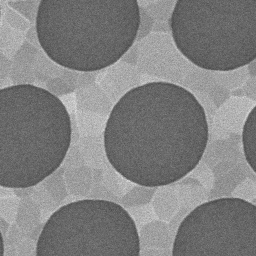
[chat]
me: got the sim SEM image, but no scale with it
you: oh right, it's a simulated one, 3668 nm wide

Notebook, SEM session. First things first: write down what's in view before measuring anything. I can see holes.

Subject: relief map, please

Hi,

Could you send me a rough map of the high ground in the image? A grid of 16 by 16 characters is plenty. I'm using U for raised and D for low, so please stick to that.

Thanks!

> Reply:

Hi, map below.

UUDDDDDDDUUDDDDD
UUDDDDDDDUUDDDDD
UUDDDDDDUUUDDDDD
UUUDDDDDUUUUDDDD
UUUUUDUUUUUUUUUU
DDDUUUUUDDDUUUUU
DDDDUUUDDDDDUUUU
DDDDUUUDDDDDDUUD
DDDDUUDDDDDDDUUD
DDDDUUUDDDDDDUUD
DDDDUUUDDDDDUUUU
DDUUUUUUUDDUUUUU
UUUUUUDUUUUUUDDU
UUUDDDDDUUUUDDDD
UUUDDDDDDUUDDDDD
UUDDDDDDDUUDDDDD